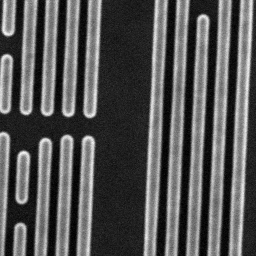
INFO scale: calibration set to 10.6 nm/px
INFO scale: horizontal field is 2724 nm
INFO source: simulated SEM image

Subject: groups of lines, slits or small figures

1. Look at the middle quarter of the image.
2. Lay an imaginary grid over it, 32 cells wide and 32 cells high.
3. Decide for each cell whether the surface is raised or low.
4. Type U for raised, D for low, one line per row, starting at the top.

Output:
UUUDDUUUDDDDDDDDDDDDDDUUUDDDUUDD
UUUDDUUUDDDDDDDDDDDDDDUUUDDDUUDD
UUUDDUUUDDDDDDDDDDDDDDUUUDDDUUDD
UUUDDUUUDDDDDDDDDDDDDDUUUDDDUUDD
UUUDDUUUDDDDDDDDDDDDDDUUUDDDUUDD
UUUDDUUUDDDDDDDDDDDDDDUUUDDDUUDD
UUUDDUUUDDDDDDDDDDDDDDUUUDDDUUDD
UUUDDUUUDDDDDDDDDDDDDDUUUDDUUUDD
UUUDDUUUDDDDDDDDDDDDDDUUDDDUUUDD
UUUDDUUUDDDDDDDDDDDDDDUUDDDUUUDD
UUDDDUUUDDDDDDDDDDDDDDUUDDDUUUDD
UUDDDUUUDDDDDDDDDDDDDDUUDDDUUUDD
UUDDDUUUDDDDDDDDDDDDDDUUDDDUUUDD
DDDDDDDDDDDDDDDDDDDDDDUUDDDUUUDD
DDDDDDDDDDDDDDDDDDDDDDUUDDDUUUDD
DDDDDDDDDDDDDDDDDDDDDDUUDDDUUUDD
DDDDDDDDDDDDDDDDDDDDDDUUDDDUUUDD
DDDDDDDDDDDDDDDDDDDDDDUUDDDUUDDD
UUDDDUUDDDDDDDDDDDDDDDUUDDDUUDDD
UUDDDUUDDDDDDDDDDDDDDUUUDDDUUDDD
UUDDDUUDDDDDDDDDDDDDDUUUDDDUUDDD
UUDDDUUDDDDDDDDDDDDDDUUUDDDUUDDD
UUDDDUUDDDDDDDDDDDDDDUUUDDDUUDDD
UUDDDUUDDDDDDDDDDDDDDUUUDDDUUDDD
UUDDDUUDDDDDDDDDDDDDDUUUDDDUUDDD
UUDDDUUDDDDDDDDDDDDDDUUUDDUUUDDD
UUDDUUUDDDDDDDDDDDDDDUUUDDUUUDDD
UUDDUUUDDDDDDDDDDDDDDUUUDDUUUDDD
UUDDUUUDDDDDDDDDDDDDDUUUDDUUUDDD
UUDDUUUDDDDDDDDDDDDDDUUUDDUUUDDD
UUDDUUUDDDDDDDDDDDDDDUUUDDUUUDDD
UUDDUUUDDDDDDDDDDDDDDUUDDDUUUDDU